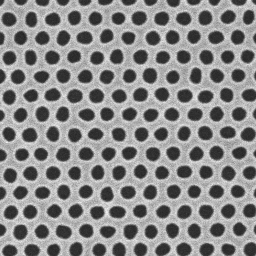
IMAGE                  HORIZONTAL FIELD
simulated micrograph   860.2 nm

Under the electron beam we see a regular array of holes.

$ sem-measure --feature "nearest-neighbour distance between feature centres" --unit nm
70.6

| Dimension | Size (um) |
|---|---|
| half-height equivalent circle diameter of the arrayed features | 0.0476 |